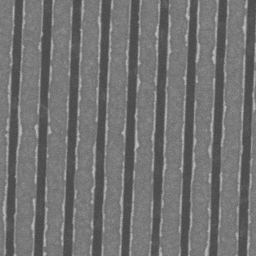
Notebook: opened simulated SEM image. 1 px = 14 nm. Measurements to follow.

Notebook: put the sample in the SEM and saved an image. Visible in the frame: parallel lines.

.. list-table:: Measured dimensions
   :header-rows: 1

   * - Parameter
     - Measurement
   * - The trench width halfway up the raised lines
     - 129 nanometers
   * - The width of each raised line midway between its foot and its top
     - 281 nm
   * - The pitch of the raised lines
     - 407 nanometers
